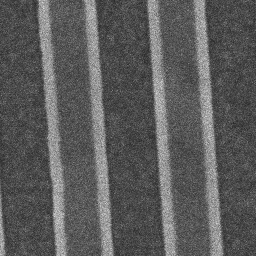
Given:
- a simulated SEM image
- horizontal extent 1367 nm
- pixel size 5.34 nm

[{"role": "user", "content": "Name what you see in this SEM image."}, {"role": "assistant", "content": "one or a few lines or trenches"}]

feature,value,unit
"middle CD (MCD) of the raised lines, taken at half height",255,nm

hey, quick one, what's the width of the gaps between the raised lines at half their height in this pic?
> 328 nanometers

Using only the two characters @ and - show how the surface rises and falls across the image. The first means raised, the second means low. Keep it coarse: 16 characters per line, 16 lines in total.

---@@@----@@@---
---@@@----@@@---
---@@@----@@@---
---@@@----@@@---
---@@@----@@@---
---@@@----@@@---
---@@@----@@@---
---@@@----@@@---
---@@@----@@@---
---@@@----@@@---
---@@@----@@@---
----@@----@@@---
----@@@---@@@---
----@@@---@@@---
----@@@----@@@--
----@@@----@@@--